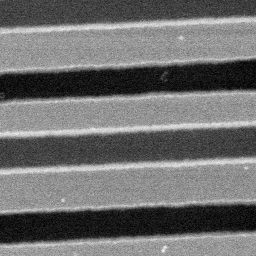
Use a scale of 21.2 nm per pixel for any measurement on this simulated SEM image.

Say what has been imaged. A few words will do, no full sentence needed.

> lines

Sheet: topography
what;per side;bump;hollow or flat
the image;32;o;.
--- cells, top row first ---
................................
................................
................................
...........ooooooooooooooooooooo
oooooooooooooooooooooooooooooooo
oooooooooooooooooooooooooooooooo
oooooooooooooooooooooooooooooooo
ooooooooooooooooooooooooo.......
ooooooo.........................
................................
................................
................................
..........oooooooooooooooooooooo
oooooooooooooooooooooooooooooooo
oooooooooooooooooooooooooooooooo
ooooooooooooooooooooooooooo.....
oooooooo........................
................................
................................
................................
........................oooooooo
...ooooooooooooooooooooooooooooo
oooooooooooooooooooooooooooooooo
oooooooooooooooooooooooooooooooo
oooooooooooooooooooooooooooooooo
oooooooooooooooooooo............
................................
................................
................................
...........................ooooo
.......ooooooooooooooooooooooooo
oooooooooooooooooooooooooooooooo